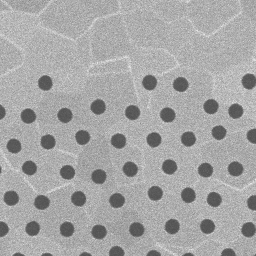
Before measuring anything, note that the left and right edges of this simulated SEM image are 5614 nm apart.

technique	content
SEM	a regular array of holes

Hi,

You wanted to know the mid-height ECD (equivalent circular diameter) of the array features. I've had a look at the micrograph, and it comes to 15.7 pixels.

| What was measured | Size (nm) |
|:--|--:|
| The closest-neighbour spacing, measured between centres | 655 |